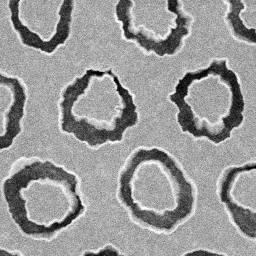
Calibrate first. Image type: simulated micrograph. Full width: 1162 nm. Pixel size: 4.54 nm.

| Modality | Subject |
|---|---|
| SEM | ring-shaped grooves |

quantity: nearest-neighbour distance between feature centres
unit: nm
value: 452